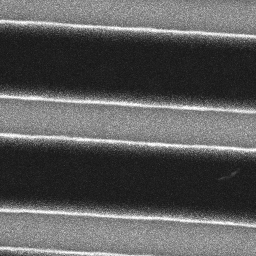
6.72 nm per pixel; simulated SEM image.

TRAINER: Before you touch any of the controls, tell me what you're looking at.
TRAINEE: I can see one or a few lines or trenches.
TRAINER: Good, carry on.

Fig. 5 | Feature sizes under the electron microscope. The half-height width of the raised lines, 0.515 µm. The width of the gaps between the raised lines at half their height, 247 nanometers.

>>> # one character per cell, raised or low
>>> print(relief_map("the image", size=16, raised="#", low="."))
................
####............
################
################
################
################
.......#########
................
##..............
################
################
################
################
......##########
................
#...............